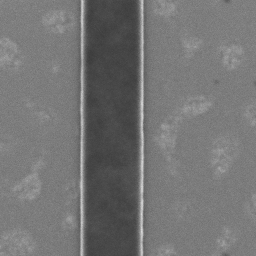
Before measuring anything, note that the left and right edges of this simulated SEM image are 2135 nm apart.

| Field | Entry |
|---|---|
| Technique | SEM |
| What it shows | one or a few lines or trenches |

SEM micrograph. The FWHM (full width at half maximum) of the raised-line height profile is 511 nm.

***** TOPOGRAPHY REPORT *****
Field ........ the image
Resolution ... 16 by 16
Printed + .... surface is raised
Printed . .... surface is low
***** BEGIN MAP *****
.....++++.......
.....++++.......
.....++++.......
.....++++.......
.....++++.......
.....++++.......
.....++++.......
.....++++.......
.....++++.......
.....++++.......
.....++++.......
.....++++.......
.....++++.......
.....++++.......
.....++++.......
.....++++.......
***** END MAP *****